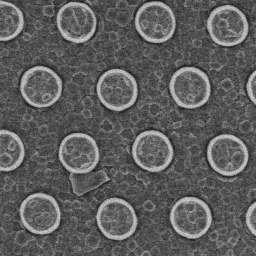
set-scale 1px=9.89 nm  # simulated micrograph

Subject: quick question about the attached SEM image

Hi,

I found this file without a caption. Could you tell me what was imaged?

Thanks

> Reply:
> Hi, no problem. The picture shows a regular array of raised bodies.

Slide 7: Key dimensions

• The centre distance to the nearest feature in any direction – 715 nm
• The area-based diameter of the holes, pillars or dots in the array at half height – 377 nm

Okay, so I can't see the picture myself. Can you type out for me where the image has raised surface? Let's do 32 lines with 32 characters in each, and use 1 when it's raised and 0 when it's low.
10000000000000000001000000000000
11000000111000000111100000011100
11100001111100000111110000111110
11100001111100000111110000111110
11000000111000000011100000011100
00000000000000000000000000001000
00000000000000000000000000000000
00000000000000000000000000000000
00000000000000000000000000000000
00011110000001110000001110000001
00011110000011111000011111000001
00011110000011111000001111000001
00011110000001111000001111000000
00000000000000100000000000000000
00000000000000000000000000000000
00000000000000000000000000000000
00000000000000000000000000000000
11000000111000000111100000011100
11100000111100000111100000111110
11100000111100000111100000111110
11000000111100000111100000111110
00000000001000000000000000001100
00000000000000000000000000000000
00000000000000000000000000000000
00001100000000000000000000000000
00011110000001110000001110000000
00011110000011111000001111000001
00011110000011111000011111000001
00001110000001111000001111000001
00000000000000110000000000000000
00000000000000000000000000000000
00000000000000000000000000000000